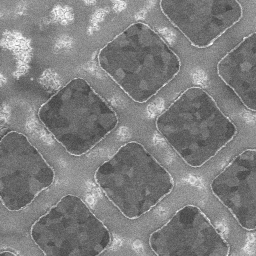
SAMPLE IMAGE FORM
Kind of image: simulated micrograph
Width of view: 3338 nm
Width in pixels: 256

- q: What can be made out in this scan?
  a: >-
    raised bodies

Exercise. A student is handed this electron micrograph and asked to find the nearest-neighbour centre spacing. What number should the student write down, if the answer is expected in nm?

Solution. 1070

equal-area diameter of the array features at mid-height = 0.914 um